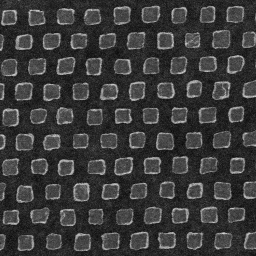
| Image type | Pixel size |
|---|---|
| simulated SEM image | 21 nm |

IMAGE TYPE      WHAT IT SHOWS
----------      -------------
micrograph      a regular array of raised bodies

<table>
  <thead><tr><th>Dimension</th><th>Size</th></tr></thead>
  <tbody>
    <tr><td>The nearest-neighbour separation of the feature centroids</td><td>578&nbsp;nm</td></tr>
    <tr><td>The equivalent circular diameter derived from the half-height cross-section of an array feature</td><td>353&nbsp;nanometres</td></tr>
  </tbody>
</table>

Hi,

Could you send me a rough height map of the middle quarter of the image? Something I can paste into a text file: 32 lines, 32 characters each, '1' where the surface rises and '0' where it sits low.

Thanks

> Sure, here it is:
11100011100001110000111100011100
11000011100001111000111100011100
00000011100000000000000000011000
00000000000000000000000000000000
00000000000000000000000000000000
00111100001110000111000111100001
00111100001110000111000111100001
00111100011110000111000011100001
00011100011110000110000000000000
00000000000000000000000000000000
00000000000000000000000000000000
11000000100000110000111000011110
11000011100001110000111100011110
11000011100001111000111000011100
11000011100001110000111000010000
00000000000000000000000000000000
00000000000000000000000000000000
00000000001110000111000011100001
00111100011110001111000111100001
00111100011110000111000111100001
00111100011110000111000111100001
00000000000000000000000000000000
00000000000000000000000000000000
00000000000000010000000000001110
11000011110001111000111100011110
11000011110001111000111100011110
11000011110001111000111100011110
11000000100001000000000000000000
00000000000000000000000000000000
00000000000000000000000001100000
00011100001110000111100011110001
00011100001110000111100011100001